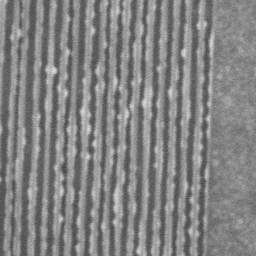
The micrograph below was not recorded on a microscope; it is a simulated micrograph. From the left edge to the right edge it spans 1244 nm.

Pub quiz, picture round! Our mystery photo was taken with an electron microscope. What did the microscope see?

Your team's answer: parallel lines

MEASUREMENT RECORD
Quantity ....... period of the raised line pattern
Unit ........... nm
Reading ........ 60.5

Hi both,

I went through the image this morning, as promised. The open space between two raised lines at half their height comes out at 32.2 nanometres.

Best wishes